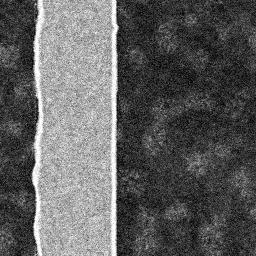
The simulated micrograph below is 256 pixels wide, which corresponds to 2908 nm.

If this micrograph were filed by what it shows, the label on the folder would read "one or a few lines or trenches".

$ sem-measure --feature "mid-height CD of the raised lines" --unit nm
868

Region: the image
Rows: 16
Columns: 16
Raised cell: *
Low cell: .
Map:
...****.........
..*****.........
..*****.........
..*****.........
..*****.........
..*****.........
..*****.........
...****.........
..*****.........
..*****.........
..*****.........
..*****.........
..*****.........
..*****.........
..*****.........
..*****.........